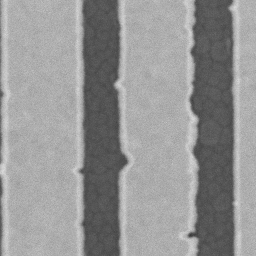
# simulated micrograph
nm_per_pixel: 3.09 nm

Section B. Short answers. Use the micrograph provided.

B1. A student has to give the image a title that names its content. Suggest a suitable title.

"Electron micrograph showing one or a few lines or trenches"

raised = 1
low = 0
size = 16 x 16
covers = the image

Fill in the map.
1111100111110001
1111100011110001
1111100011110001
1111100011110001
1111100011110001
1111100111110001
1111100011110001
1111100011110001
1111100011110001
1111100011110001
1111100011110001
1111100011110001
1111100011110001
1111100011110001
1111100011110001
1111100011110001